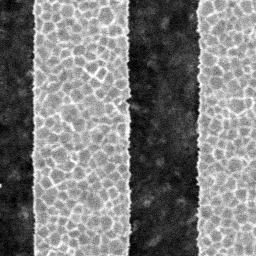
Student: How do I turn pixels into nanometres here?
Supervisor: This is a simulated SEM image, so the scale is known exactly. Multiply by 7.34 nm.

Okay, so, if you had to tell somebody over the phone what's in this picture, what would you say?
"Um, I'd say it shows one or a few lines or trenches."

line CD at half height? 691 nm